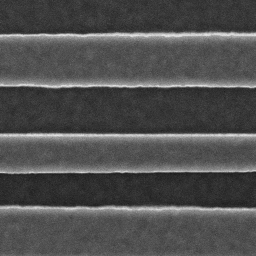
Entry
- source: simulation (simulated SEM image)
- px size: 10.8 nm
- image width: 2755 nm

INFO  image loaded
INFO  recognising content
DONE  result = lines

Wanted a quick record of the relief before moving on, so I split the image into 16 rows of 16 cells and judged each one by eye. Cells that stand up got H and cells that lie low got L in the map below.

LLLLLLLLLLLLLLLL
LLLLLLLLLLLLLLLL
HHHHHHHHHHHHHHHH
HHHHHHHHHHHHHHHH
HHHHHHHHHHHHHHHH
LLLLLLLLLLLLLLLL
LLLLLLLLLLLLLLLL
LLLLLLLLLLLLLLLL
HHHHHHHHLLHLHHHH
HHHHHHHHHHHHHHHH
HHHHHHHHHHHHHHHH
LLLLLLLLLLLLLLLL
LLLLLLLLLLLLLLLL
HHHHHHHHHHHHHHHH
HHHHHHHHHHHHHHHH
HHHHHHHHHHHHHHHH